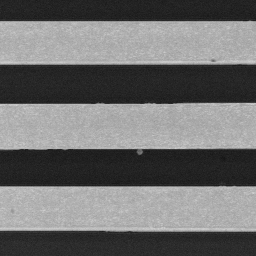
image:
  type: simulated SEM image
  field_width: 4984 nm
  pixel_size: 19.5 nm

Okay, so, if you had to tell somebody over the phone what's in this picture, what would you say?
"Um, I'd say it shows lines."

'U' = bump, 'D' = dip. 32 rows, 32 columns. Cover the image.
DDDDDDDDDDDDDDDDDDDDDDDDDDDDDDDD
DDDDDDDDDDDDDDDDDDDDDDDDDDDDDDDD
DDDDDDDDDDDDDDDDDDDDDDDDDDDDDDDD
UUUUUUUUUUUUUUUUUUUUUUUUUUUUUUUU
UUUUUUUUUUUUUUUUUUUUUUUUUUUUUUUU
UUUUUUUUUUUUUUUUUUUUUUUUUUUUUUUU
UUUUUUUUUUUUUUUUUUUUUUUUUUUUUUUU
UUUUUUUUUUUUUUUUUUUUUUUUUUUUUUUU
DDDDDDDDDDDDDDDDDDDDDDDDDDDDDDDD
DDDDDDDDDDDDDDDDDDDDDDDDDDDDDDDD
DDDDDDDDDDDDDDDDDDDDDDDDDDDDDDDD
DDDDDDDDDDDDDDDDDDDDDDDDDDDDDDDD
DDDDDDDDDDDDDDDDDDDDDDDDDDDDDDDD
UUUUUUUUUUUUUUUUUUUUUUUUUUUUUUUU
UUUUUUUUUUUUUUUUUUUUUUUUUUUUUUUU
UUUUUUUUUUUUUUUUUUUUUUUUUUUUUUUU
UUUUUUUUUUUUUUUUUUUUUUUUUUUUUUUU
UUUUUUUUUUUUUUUUUUUUUUUUUUUUUUUU
UUUUUUUUUUUUUUUUUUUUUUUUUUUUUUUU
DDDDDDDDDDDDDDDDDDDDDDDDDDDDDDDD
DDDDDDDDDDDDDDDDDDDDDDDDDDDDDDDD
DDDDDDDDDDDDDDDDDDDDDDDDDDDDDDDD
DDDDDDDDDDDDDDDDDDDDDDDDDDDDDDDD
UUUUUUUUUUUUUUUUUUUUUUUUUUUUUUUU
UUUUUUUUUUUUUUUUUUUUUUUUUUUUUUUU
UUUUUUUUUUUUUUUUUUUUUUUUUUUUUUUU
UUUUUUUUUUUUUUUUUUUUUUUUUUUUUUUU
UUUUUUUUUUUUUUUUUUUUUUUUUUUUUUUU
UUUUUUUUUUUUUUUUUUUUUUUUUUUUUUUU
DDDDDDDDDDDDDDDDDDDDDDDDDDDDDDDD
DDDDDDDDDDDDDDDDDDDDDDDDDDDDDDDD
DDDDDDDDDDDDDDDDDDDDDDDDDDDDDDDD